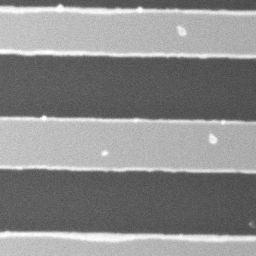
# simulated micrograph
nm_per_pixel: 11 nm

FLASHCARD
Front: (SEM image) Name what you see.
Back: lines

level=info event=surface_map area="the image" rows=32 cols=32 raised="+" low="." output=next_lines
................................
+++++++++++++++++++++++++++.....
++++++++++++++++++++++++++++++++
++++++++++++++++++++++++++++++++
++++++++++++++++++++++++++++++++
++++++++++++++++++++++++++++++++
++++++++++++++++++++++++++++++++
................................
................................
................................
................................
................................
................................
................................
................................
++++++++++++++++++++++++++++++++
++++++++++++++++++++++++++++++++
++++++++++++++++++++++++++++++++
++++++++++++++++++++++++++++++++
++++++++++++++++++++++++++++++++
++++++++++++++++++++++++++++++++
..............................++
................................
................................
................................
................................
................................
................................
................................
+++++++++++.......+.............
++++++++++++++++++++++++++++++++
++++++++++++++++++++++++++++++++